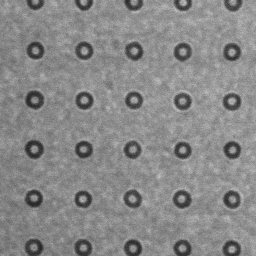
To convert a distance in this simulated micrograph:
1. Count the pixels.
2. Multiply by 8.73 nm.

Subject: a regular array of ring-shaped grooves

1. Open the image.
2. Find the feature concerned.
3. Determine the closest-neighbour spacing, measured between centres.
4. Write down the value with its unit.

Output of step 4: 48.7 pixels